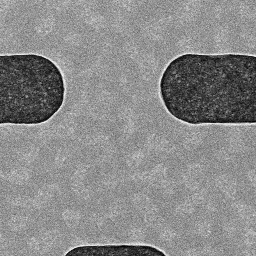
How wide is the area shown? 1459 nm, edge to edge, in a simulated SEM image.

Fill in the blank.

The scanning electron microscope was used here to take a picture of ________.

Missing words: holes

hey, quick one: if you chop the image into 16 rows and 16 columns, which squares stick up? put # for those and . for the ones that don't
################
################
################
..#########.....
....######......
....######......
....######......
...########.....
################
################
################
################
################
################
################
#####.....######